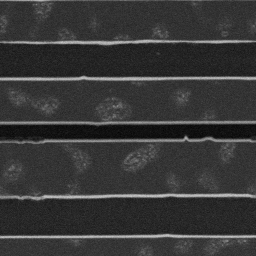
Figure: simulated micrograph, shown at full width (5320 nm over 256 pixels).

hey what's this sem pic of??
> one or a few lines or trenches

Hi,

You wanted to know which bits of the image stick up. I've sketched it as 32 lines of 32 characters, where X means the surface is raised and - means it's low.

XXXXXXXXXXXXXXXXXXXXXXXXXXXXXXXX
XXXXXXXXXXXXXXXXXXXXXXXXXXXXXXXX
XXXXXXXXXXXXXXXXXXXXXXXXXXXXXXXX
XXXXXXXXXXXXXXXXXXXXXXXXXXXXXXXX
XXXXXXXXXXXXXXXXXXXXXXXXXXXXXXXX
--------------------------------
--------------------------------
--------------------------------
--------------------------------
--------------------------------
XXXXXXXXXXXXXXXXXXXXXXXXXXXXXXXX
XXXXXXXXXXXXXXXXXXXXXXXXXXXXXXXX
XXXXXXXXXXXXXXXXXXXXXXXXXXXXXXXX
XXXXXXXXXXXXXXXXXXXXXXXXXXXXXXXX
XXXXXXXXXXXXXXXXXXXXXXXXXXXXXXXX
--------------------------------
--------------------------------
-----------------------X-XX-----
XXXXXXXXXXXXXXXXXXXXXXXXXXXXXXXX
XXXXXXXXXXXXXXXXXXXXXXXXXXXXXXXX
XXXXXXXXXXXXXXXXXXXXXXXXXXXXXXXX
XXXXXXXXXXXXXXXXXXXXXXXXXXXXXXXX
XXXXXXXXXXXXXXXXXXXXXXXXXXXXXXXX
XXXXXXXXXXXXXXXXXXXXXXXXXXXXXXXX
XXXXXXXXXXXXXX-----------------X
--------------------------------
--------------------------------
--------------------------------
--------------------------------
--------------------XX----------
XXXXXXXXXXXXXXXXXXXXXXXXXXXXXXXX
XXXXXXXXXXXXXXXXXXXXXXXXXXXXXXXX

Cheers